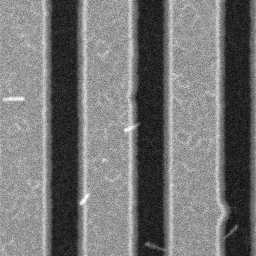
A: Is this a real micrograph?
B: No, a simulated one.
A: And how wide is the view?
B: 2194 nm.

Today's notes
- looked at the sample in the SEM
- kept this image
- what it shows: one or a few lines or trenches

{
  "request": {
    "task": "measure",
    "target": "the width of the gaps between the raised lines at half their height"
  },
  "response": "300 nm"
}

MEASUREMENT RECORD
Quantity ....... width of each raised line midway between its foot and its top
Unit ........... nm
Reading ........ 444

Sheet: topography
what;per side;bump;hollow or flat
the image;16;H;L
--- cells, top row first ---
HHHLLHHHLLLHHHLL
HHHLLHHHLLLHHHLL
HHHLLHHHLLLHHHLL
HHHLLHHHLLLHHHLL
HHHLLHHHLLHHHHLL
HHHLLHHHLLLHHHLL
HHHLLHHHLLLHHHLL
HHHLLHHHLLLHHHLL
HHHLLHHHLLLHHHLL
HHHLLHHHLLLHHHLL
HHHLLHHHLLLHHHLL
HHHLLHHHLLLHHHLL
HHHLLHHHLLHHHHLL
HHHLLHHHLLLHHHLL
HHHLLHHHLLLHHHLL
HHHLLHHHLLLHHHLL